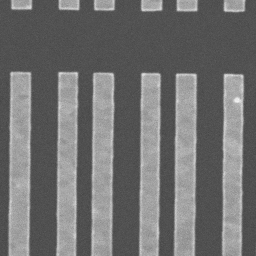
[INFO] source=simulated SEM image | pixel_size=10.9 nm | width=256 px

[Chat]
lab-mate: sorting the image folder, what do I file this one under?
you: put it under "wiring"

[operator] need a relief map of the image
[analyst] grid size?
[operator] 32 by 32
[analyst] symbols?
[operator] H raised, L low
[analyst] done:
LLHHLLLLHHLLHHLLLLHHLLHHHLLLHHHL
LLLLLLLLLLLLLLLLLLLLLLLLLLLLLLLL
LLLLLLLLLLLLLLLLLLLLLLLLLLLLLLLL
LLLLLLLLLLLLLLLLLLLLLLLLLLLLLLLL
LLLLLLLLLLLLLLLLLLLLLLLLLLLLLLLL
LLLLLLLLLLLLLLLLLLLLLLLLLLLLLLLL
LLLLLLLLLLLLLLLLLLLLLLLLLLLLLLLL
LLLLLLLLLLLLLLLLLLLLLLLLLLLLLLLL
LLLLLLLLLLLLLLLLLLLLLLLLLLLLLLLL
LHHHLLLHHHLLHHLLLLHHLLHHLLLLHHLL
LHHHLLLHHHLLHHLLLLHHLLHHLLLLHHLL
LHHHLLLHHHLLHHLLLLHHLLHHLLLLHHLL
LHHHLLLHHHLLHHLLLLHHLLHHLLLLHHLL
LHHHLLLHHHLLHHLLLLHHLLHHLLLLHHLL
LHHHLLLHHHLLHHLLLLHHLLHHLLLLHHLL
LHHHLLLHHHLLHHLLLLHHLLHHLLLLHHLL
LHHHLLLHHHLLHHLLLLHHLLHHLLLLHHLL
LHHHLLLHHHLLHHLLLLHHLLHHLLLLHHLL
LHHHLLLHHHLLHHLLLLHHLLHHLLLLHHLL
LHHHLLLHHHLLHHLLLLHHLLHHLLLLHHLL
LHHHLLLHHHLLHHLLLLHHLLHHLLLLHHLL
LHHHLLLHHLLLHHLLLLHHLLHHLLLLHHLL
LHHHLLLHHLLLHHLLLLHHLLHHLLLLHHLL
LHHHLLLHHLLLHHLLLLHHLLHHLLLLHHLL
LHHHLLLHHLLLHHLLLLHHLLHHLLLLHHLL
LHHHLLLHHLLLHHLLLLHHLLHHLLLLHHLL
LHHHLLLHHLLLHHLLLLHHLLHHLLLLHHLL
LHHHLLLHHLLLHHLLLLHHLLHHLLLLHHLL
LHHHLLLHHLLLHHLLLLHHLLHHLLLLHHLL
LHHHLLLHHLLLHHLLLLHHLLHHLLLLHHLL
LHHHLLLHHLLLHHLLLLHHLLHHLLLLHHLL
LHHHLLLHHLLLHHLLLLHHLLHHLLLLHHLL